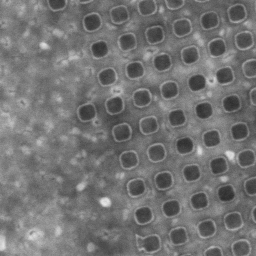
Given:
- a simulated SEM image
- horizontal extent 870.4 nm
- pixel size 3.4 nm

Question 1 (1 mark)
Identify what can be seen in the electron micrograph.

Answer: a regular array of raised bodies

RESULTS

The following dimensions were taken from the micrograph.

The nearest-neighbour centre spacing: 28.1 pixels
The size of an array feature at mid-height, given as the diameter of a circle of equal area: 18.9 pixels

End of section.